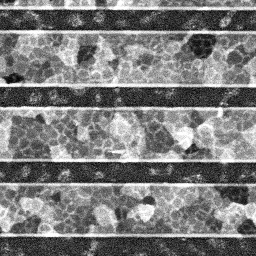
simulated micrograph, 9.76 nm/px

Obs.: one or a few lines or trenches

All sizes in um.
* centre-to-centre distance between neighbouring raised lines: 0.738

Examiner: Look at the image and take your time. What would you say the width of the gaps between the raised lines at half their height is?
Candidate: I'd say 0.231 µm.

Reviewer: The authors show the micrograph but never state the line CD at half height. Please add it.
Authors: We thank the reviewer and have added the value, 509 nm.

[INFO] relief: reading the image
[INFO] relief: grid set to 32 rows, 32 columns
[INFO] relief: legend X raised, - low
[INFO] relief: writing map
XXXXXXXXXXXXXXXXXXXXXXXXXXXXXXXX
--------------------------------
--------------------------------
--------------------------------
XXXXXXXXXXXXXXXXXXXXXXXXXXXXXXXX
XXXXXXXXXXXXXXXXXXXXXXXXXXXXXXXX
XXXXXXXXXXXXXXXXXXXXXXXXXXXXXXXX
XXXXXXXXXXXXXXXXXXXXXXXXXXXXXXXX
XXXXXXXXXXXXXXXXXXXXXXXXXXXXXXXX
XXXXXXXXXXXXXXXXXXXXXXXXXXXXXXXX
XXXXXXXXXXXXXXXXXXXXXXXXXXXXXXXX
--------------------------------
--------------------------------
----------------------X---------
XXXXXXXXXXXXXXXXXXXXXXXXXXXXXXXX
XXXXXXXXXXXXXXXXXXXXXXXXXXXXXXXX
XXXXXXXXXXXXXXXXXXXXXXXXXXXXXXXX
XXXXXXXXXXXXXXXXXXXXXXXXXXXXXXXX
XXXXXXXXXXXXXXXXXXXXXXXXXXXXXXXX
XXXXXXXXXXXXXXXXXXXXXXXXXXXXXXXX
--------------------------------
--------------------------------
--------------------------------
XXXXXXXXXXXXXXXXXXXXXXXXXXXXXXXX
XXXXXXXXXXXXXXXXXXXXXXXXXXXXXXXX
XXXXXXXXXXXXXXXXXXXXXXXXXXXXXXXX
XXXXXXXXXXXXXXXXXXXXXXXXXXXXXXXX
XXXXXXXXXXXXXXXXXXXXXXXXXXXXXXXX
XXXXXXXXXXXXXXXXXXXXXXXXXXXXXXXX
--------------------------------
--------------------------------
--------------------------------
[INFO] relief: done